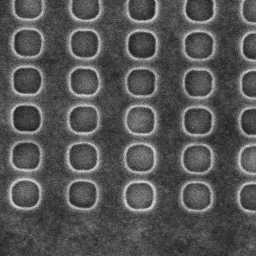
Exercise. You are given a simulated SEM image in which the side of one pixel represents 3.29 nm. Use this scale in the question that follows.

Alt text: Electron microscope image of a regular array of holes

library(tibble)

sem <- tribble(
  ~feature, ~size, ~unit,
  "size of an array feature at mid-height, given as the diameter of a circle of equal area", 96.9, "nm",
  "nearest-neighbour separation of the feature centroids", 124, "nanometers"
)